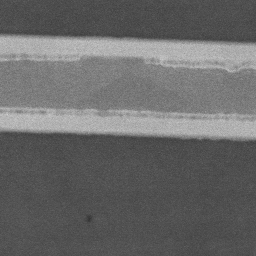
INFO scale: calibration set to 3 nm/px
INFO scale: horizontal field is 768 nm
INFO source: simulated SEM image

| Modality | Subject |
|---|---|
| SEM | one or a few lines or trenches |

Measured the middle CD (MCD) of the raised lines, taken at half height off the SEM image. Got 228 nm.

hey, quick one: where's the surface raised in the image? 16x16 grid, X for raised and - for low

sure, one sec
----------------
----------------
----------------
XXXXXXXXXXXXXXXX
XXXXXXXXXXXXXXXX
XXXXXXXXXXXXXXXX
XXXXXXXXXXXXXXXX
XXXXXXXXXXXXXXXX
----------------
----------------
----------------
----------------
----------------
----------------
----------------
----------------